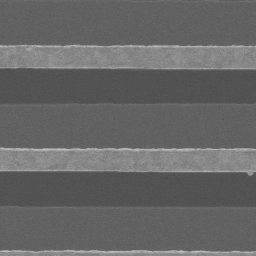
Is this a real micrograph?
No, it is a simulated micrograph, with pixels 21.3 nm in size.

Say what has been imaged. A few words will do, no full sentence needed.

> lines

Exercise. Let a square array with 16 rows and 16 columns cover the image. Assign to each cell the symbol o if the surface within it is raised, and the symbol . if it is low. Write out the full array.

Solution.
oooooooooooooooo
oooooooooooooooo
oooooooooooooooo
oooooooooooooooo
................
................
................
oooooooooooooooo
oooooooooooooooo
oooooooooooooooo
oooooooooooooooo
................
................
oooooooooooooooo
oooooooooooooooo
oooooooooooooooo